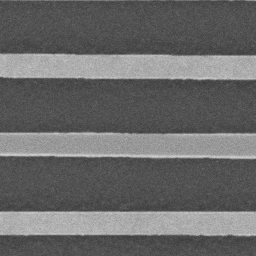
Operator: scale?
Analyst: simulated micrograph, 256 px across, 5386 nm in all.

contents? lines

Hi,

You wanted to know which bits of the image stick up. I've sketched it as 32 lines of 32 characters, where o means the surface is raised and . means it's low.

................................
................................
................................
................................
................................
................................
................................
oooooooooooooooooooooooooooooooo
oooooooooooooooooooooooooooooooo
oooooooooooooooooooooooooooooooo
................................
................................
................................
................................
................................
................................
................................
oooooooooooooooooooooooooooooooo
oooooooooooooooooooooooooooooooo
..........................oooooo
................................
................................
................................
................................
................................
................................
................................
oooooooooooooooooooooooooooooooo
oooooooooooooooooooooooooooooooo
................................
................................
................................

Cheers